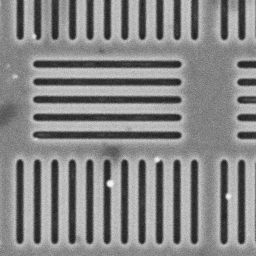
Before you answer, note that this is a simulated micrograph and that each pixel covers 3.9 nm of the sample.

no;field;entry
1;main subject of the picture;groups of lines, slits or small figures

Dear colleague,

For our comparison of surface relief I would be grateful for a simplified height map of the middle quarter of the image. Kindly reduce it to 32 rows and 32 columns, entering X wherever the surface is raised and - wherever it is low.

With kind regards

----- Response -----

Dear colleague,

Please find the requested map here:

-----------------------------XXX
XXXXXXXXXXXXXXXXXXXXXXXXXXXXXXXX
XXXXXXXXXXXXXXXXXXXXXXXXXXXXXXXX
---------------XXXXXXXXXXXXXXXXX
-----------------------------XXX
----------------------------XXXX
XXXXXXXXXXXXXXXXXXXXXXXXXXXXXXXX
XXXXXXXXXXXXXXXXXXXXXXXXXXXXXXXX
-----------------------------XXX
-----------------------------XXX
XXXXXXXXXXXXXXXXXXXXXXXXXXXXXXXX
XXXXXXXXXXXXXXXXXXXXXXXXXXXXXXXX
-----------------------------XXX
-----------------------------XXX
XXXXXXXXXXXXXXXXXXXXXXXXXXXXXXXX
XXXXXXXXXXXXXXXXXXXXXXXXXXXXXXXX
XXXXXXXXXXXXXXXXXXXXXXXXXXXXXXXX
-----------------------------XXX
-----------------------------XXX
XXXXXXXXXXXXXXXXXXXXXXXXXXXXXXXX
XXXXXXXXXXXXXXXXXXXXXXXXXXXXXXXX
XXXXXXXXXXXXXXXXXXXXXXXXXXXXXXXX
XXXXXXXXXXXXXXXXXXXXXXXXXXXXXXXX
XXXXXXXXXXXXXXXXXXXXXXXXXXXXXXXX
X--XXX-XXX--XX--XXX-XXX--XX--XXX
X--XX--XXX--XX--XXX--XX--XX--XXX
X--XX--XXX--XX--XXX--XX--XX--XXX
X--XX--XXX--XX--XXX--XX--XX--XXX
X--XX--XXX--XX--XXX--XX--XX--XXX
X--XX--XXX-XXX--XXX--XX--XX--XXX
X--XX--XXX-XXX--XXX--XX--XX--XXX
X--XX--XXX--XX--XXX--XX--XX--XXX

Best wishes